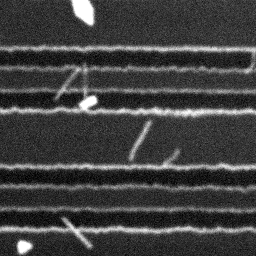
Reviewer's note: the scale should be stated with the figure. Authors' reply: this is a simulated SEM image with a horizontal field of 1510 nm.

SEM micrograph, lines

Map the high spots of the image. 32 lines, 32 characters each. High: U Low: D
UUUUUUUUUUUUUUUUUUUUUUUUUUUUUUUU
UUUUUUUUUUUUUUUUUUUUUUUUUUUUUUUU
UUUUUUUUUUUUUUUUUUUUUUUUUUUUUUUU
UUUUUUUUUUUUUUUUUUUUUUUUUUUUUUUU
UUUUUUUUUUUUUUUUUUUUUUUUUUUUUUUU
UUUUUUUUUUUUUUUUUUUUUUUUUUUUUUUU
DDDDDDDDDDDDDDDDDDDDDDDDDDDDDDDD
DDDDDDDDDDDDDDDDDDDDDDDDDDDDDDDD
UUUDUDDDUUDUDDDDUDDDDUDDDDDDDDDD
UUUUUUUUUUUUUUUUUUUUUUUUUUUUUUUU
UUUUUUUUUUUUUUUUUUUUUUUUUUUUUUUU
DDDDDDDUDDUDDDDDDUDUDDDDDUUUUUUU
DDDDDDDDDDDDDDDDDDDDDDDDDDDDDDDD
DDDDDDDDDDDDDDDDDDDDDDDDDDDDDDDD
UUUUUUUUUUUUUUUUUUUUUUUUUUUUUUUU
UUUUUUUUUUUUUUUUUUUUUUUUUUUUUUUU
UUUUUUUUUUUUUUUUUUUUUUUUUUUUUUUU
UUUUUUUUUUUUUUUUUUUUUUUUUUUUUUUU
UUUUUUUUUUUUUUUUUUUUUUUUUUUUUUUU
UUUUUUUUUUUUUUUUUUUUUUUUUUUUUUUU
UUUUUUUUUUUUUUUUUUUUUUUUUUUUUUUU
DDDDDDDDDDDDDDDDDDDDDDDDDDDDDDDD
DDDDDDDDDDDDDDDDDDDDDDDDDDDDDDDD
UUUUUUUUUUUUUUUUUUUUUDUUUUUUUUDU
UUUUUUUUUUUUUUUUUUUUUUUUUUUUUUUU
UUUUUUUUUUUUUUUUUUUUUUUUUUUUUUUU
DDDDDDDDDDDDDDDDDDDDDDDDDDDDDDDD
DDDDDDDDDDDDDDDDDDDDDDDDDDDDDDDD
DDDDDDUDUDDDDDUDDDDDDDDUDDDDDDDD
UUUUUUUUUUUUUUUUUUUUUUUUUUUUUUUU
UUUUUUUUUUUUUUUUUUUUUUUUUUUUUUUU
UUUUUUUUUUUUUUUUUUUUUUUUUUUUUUUU